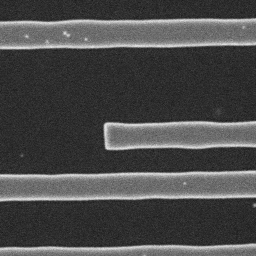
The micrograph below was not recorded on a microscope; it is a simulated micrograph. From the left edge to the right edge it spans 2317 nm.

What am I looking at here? groups of lines, slits or small figures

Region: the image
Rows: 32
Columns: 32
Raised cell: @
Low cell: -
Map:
--------------------------------
--------------------------------
---------------------@@@@@@@@@@@
@@@@@@@@@@@@@@@@@@@@@@@@@@@@@@@@
@@@@@@@@@@@@@@@@@@@@@@@@@@@@@@@@
@@@@@@@@@@@@@@@@@@@@@@@@@@@@@@@@
--------------------------------
--------------------------------
--------------------------------
--------------------------------
--------------------------------
--------------------------------
--------------------------------
--------------------------------
--------------------------------
-------------@@@-@@@@@@@@@@@@@@@
-------------@@@@@@@@@@@@@@@@@@@
-------------@@@@@@@@@@@@@@@@@@@
-------------@@@@---------------
--------------------------------
--------------------------------
----------------------------@@@@
@@@@@@@@@@@@@@@@@@@@@@@@@@@@@@@@
@@@@@@@@@@@@@@@@@@@@@@@@@@@@@@@@
@@@@@@@@@@@@@@@@@@@@@@@@@@@@@@@@
--------------------------------
--------------------------------
--------------------------------
--------------------------------
--------------------------------
--------------------------------
@@@@@@@@@@@@@@@@@@@@@@@@@@@@@@@@